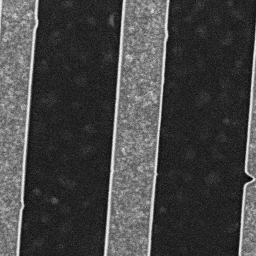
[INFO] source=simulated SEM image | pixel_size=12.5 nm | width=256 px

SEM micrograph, one or a few lines or trenches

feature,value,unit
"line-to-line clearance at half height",1.1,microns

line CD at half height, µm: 0.544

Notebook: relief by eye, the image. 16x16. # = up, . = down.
##......##......
##......##......
##......##......
##......##......
##.....###......
##.....###......
##.....###......
##.....###......
##.....###......
##.....###.....#
#......###.....#
#......###......
#......###.....#
#......##......#
#......##......#
#......##......#